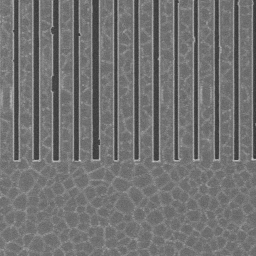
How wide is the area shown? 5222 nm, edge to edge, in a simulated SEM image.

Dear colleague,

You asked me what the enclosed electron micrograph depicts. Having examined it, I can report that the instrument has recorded parallel lines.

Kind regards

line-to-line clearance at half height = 6.25 px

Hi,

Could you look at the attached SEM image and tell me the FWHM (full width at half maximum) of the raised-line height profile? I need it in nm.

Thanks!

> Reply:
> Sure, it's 273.